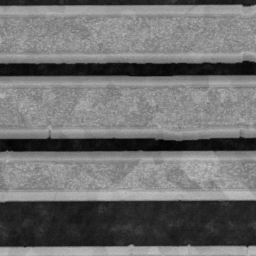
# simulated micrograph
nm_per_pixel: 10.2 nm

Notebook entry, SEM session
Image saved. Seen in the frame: one or a few lines or trenches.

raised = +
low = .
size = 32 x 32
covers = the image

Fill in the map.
................................
++++++++++++++++++++++++++++++++
++++++++++++++++++++++++++++++++
++++++++++++++++++++++++++++++++
++++++++++++++++++++++++++++++++
++++++++++++++++++++++++++++++++
++++++++++++++++++++++++++++++++
................................
................................
................................
++++++++++++++++++++++++++++++++
++++++++++++++++++++++++++++++++
++++++++++++++++++++++++++++++++
++++++++++++++++++++++++++++++++
++++++++++++++++++++++++++++++++
++++++++++++++++++++++++++++++++
++++++++++++++++++++++++++++++++
................................
................................
.................+......+.......
++++++++++++++++++++++++++++++++
++++++++++++++++++++++++++++++++
++++++++++++++++++++++++++++++++
++++++++++++++++++++++++++++++++
................................
................................
................................
................................
................................
................................
................................
..........++++++++++++++++.+++++